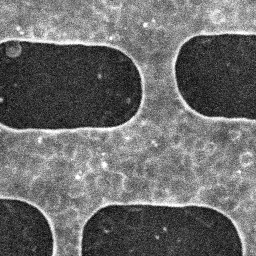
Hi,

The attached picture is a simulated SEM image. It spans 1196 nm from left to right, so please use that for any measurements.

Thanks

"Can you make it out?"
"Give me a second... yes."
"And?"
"holes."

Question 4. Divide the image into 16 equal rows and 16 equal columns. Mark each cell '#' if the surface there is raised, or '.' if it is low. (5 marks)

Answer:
################
################
############....
........###.....
.........##.....
.........##.....
.........###....
........########
################
################
################
################
.###############
...###........##
...##..........#
...##..........#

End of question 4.